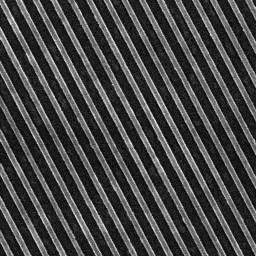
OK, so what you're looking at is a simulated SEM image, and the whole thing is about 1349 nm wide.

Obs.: parallel lines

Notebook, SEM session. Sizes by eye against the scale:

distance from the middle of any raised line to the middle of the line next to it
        82.7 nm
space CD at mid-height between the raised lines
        58.3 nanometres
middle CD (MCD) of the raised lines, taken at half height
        24.5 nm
